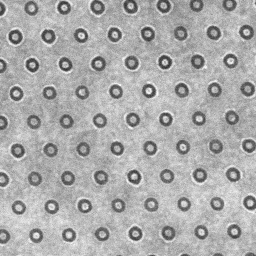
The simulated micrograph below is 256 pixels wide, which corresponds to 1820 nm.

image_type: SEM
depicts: a regular array of ring-shaped grooves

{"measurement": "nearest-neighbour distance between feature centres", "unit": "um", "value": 0.232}